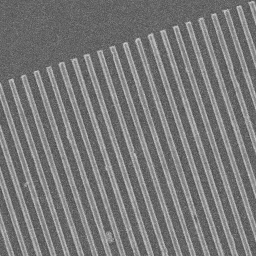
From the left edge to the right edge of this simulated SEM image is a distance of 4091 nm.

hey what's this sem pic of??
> parallel lines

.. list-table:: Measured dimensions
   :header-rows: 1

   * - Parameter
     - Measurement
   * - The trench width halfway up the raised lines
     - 150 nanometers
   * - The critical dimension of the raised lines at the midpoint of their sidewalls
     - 68.5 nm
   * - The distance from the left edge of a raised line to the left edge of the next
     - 0.212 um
